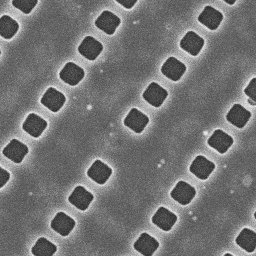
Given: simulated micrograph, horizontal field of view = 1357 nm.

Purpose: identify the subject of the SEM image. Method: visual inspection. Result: a regular array of holes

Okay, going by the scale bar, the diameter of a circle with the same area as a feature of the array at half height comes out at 125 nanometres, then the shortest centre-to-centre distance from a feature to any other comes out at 168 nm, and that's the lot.